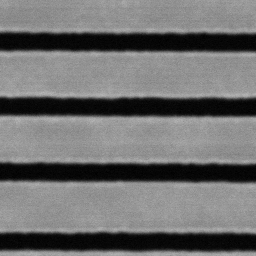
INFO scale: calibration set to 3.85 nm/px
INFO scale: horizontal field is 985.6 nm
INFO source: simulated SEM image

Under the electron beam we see lines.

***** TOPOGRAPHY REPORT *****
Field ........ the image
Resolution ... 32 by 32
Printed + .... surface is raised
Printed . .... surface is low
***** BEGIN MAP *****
++++++++++++++++++++++++++++++++
++++++++++++++++++++++++++++++++
++++++++++++++++++++++++++++++++
++++++++++++++++++++++++++++++++
................................
................................
++++++++++++++++++++++++++++++++
++++++++++++++++++++++++++++++++
++++++++++++++++++++++++++++++++
++++++++++++++++++++++++++++++++
++++++++++++++++++++++++++++++++
++++++++++++++++++++++++++++++++
................................
................................
++++++++++++......+.............
++++++++++++++++++++++++++++++++
++++++++++++++++++++++++++++++++
++++++++++++++++++++++++++++++++
++++++++++++++++++++++++++++++++
++++++++++++++++++++++++++++++++
................................
................................
................................
++++++++++++++++++++++++++++++++
++++++++++++++++++++++++++++++++
++++++++++++++++++++++++++++++++
++++++++++++++++++++++++++++++++
++++++++++++++++++++++++++++++++
++++++++++++++++++++++++++++++++
................................
................................
++++++++++++++++++++++++++++++++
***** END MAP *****